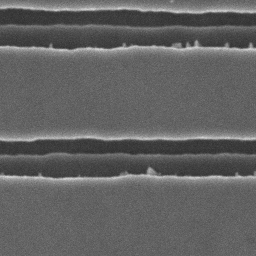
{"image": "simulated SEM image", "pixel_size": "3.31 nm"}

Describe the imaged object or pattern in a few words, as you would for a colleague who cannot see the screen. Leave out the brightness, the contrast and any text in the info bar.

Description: lines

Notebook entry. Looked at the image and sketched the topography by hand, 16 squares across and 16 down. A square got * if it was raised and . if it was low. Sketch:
****************
................
................
****************
****************
****************
****************
****************
****************
................
................
****************
****************
****************
****************
****************